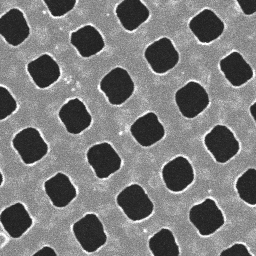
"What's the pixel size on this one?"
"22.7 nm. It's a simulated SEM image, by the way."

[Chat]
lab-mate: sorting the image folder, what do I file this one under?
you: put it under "a regular array of holes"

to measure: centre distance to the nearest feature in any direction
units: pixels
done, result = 52.2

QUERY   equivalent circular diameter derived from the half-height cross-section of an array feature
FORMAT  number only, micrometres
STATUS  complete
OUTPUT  0.762